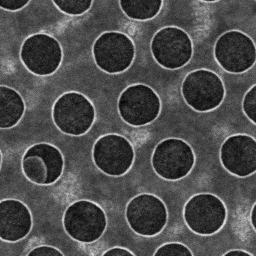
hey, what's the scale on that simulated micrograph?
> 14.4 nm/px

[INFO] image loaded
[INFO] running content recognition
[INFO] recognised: a regular array of holes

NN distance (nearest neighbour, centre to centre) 0.839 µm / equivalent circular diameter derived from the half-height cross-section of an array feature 0.595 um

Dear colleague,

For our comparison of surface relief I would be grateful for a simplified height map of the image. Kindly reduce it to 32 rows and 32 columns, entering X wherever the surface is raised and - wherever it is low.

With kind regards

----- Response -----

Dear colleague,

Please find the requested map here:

---XXXX----XXXX-----XXXXXXXXXXXX
XXXXXXXX--XXXXXX----XXXXXXXXXXXX
XXXXXXXXXXXXXXXXXXXXXXXXXXXXXXXX
XXXXXXXXXXXXXXXXXXXXX-XXXXXXXXXX
XXXX--XXXXXXX---XXX----XXXXX---X
XXX----XXXXX-----XX-----XXX-----
XXX-----XXXX-----XX-----XXX-----
XXX-----XXXX-----XXX----XXX-----
XXX----XXXXXX---XXXXX-XXXXXX---X
XXXXXXXXXXXXXXXXXXXXXXX----XXXXX
XXXXXXXXXXXXXXXXXXXXXXX-----XXXX
--XXXXXXXXXXXXX----XXXX-----XXX-
---XXXX----XXXX-----XXX-----XX--
---XXXX-----XXX-----XXXX---XXX--
---XXXX-----XXX-----XXXXXXXXXXX-
--XXXXX----XXXXX--XXXXXXXXXXXXXX
XXXXXXXX---XXXXXXXXXXXXXXXXXXXXX
XXXXXXXXXXXX----XXXXX--XXXXX----
XXXX---XXXXX----XXXX----XXXX----
XXX-----XXXX-----XX-----XXXX----
XXX-----XXXX----XXX-----XXXX----
XXX-----XXXXX---XXXX----XXXXX---
XXXX---XXXXXXXXXXXXXX-XXXXXXXXXX
XXXXXXXXXXXXXXXXXXXXXXXXXXXXXXXX
XXXXXXXXXXXXXXXXX--XXXXX---XXXXX
---XXXXXX---XXXX----XXX-----XXXX
----XXXX-----XXX-----XX-----XXXX
----XXXX-----XXX-----XX-----XXX-
----XXXX-----XXX----XXXX----XXXX
---XXXXXX----XXXXX-XXXXXXXXXXXXX
XXXXXXXXXXXXXXXXXXXXX-XXXXXXXXXX
XXXX---XXXXXX---XXX-----XXXXX--X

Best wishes